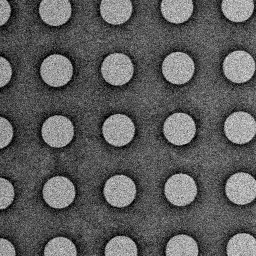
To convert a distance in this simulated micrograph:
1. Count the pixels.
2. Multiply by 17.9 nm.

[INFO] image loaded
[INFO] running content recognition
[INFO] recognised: an array of small figures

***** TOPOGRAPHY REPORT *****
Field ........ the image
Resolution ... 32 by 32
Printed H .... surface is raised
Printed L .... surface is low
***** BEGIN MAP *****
HLLLLHHHHLLLLHHHLLLLHHHHLLLLHHHH
HLLLLHHHHLLLLHHHLLLLHHHHLLLLHHHH
HLLLLHHHLLLLLHHHLLLLLHHLLLLLLHHL
LLLLLLLLLLLLLLLLLLLLLLLLLLLLLLLL
LLLLLLLLLLLLLLLLLLLLLLLLLLLLLLLL
LLLLLLLLLLLLLLLLLLLLLLLLLLLLLLLL
LLLLLLLLLLLLLLLLLLLLLLLLLLLLLHHL
HLLLLLHHHLLLLHHHLLLLLHHHLLLLHHHH
HLLLLHHHHLLLLHHHHLLLHHHHLLLLHHHH
HLLLLHHHHLLLLHHHLLLLLHHHLLLLHHHL
HLLLLLHHLLLLLLHLLLLLLLLLLLLLLLLL
LLLLLLLLLLLLLLLLLLLLLLLLLLLLLLLL
LLLLLLLLLLLLLLLLLLLLLLLLLLLLLLLL
LLLLLLLLLLLLLLLLLLLLLLLLLLLLLLLL
LLLLLLLHLLLLLLHHLLLLLHHHLLLLLHHL
HLLLLHHHHLLLLHHHHLLLLHHHLLLLHHHH
HHLLLHHHHLLLLHHHHLLLLHHHLLLLHHHH
HLLLLLHHHLLLLHHHLLLLLHHHLLLLLHHL
LLLLLLLLLLLLLLLLLLLLLLLLLLLLLLLL
LLLLLLLLLLLLLLLLLLLLLLLLLLLLLLLL
LLLLLLLLLLLLLLLLLLLLLLLLLLLLLLLL
LLLLLLLLLLLLLLLLLLLLLLLLLLLLLLLL
HLLLLLHHHLLLLLHHLLLLLHHHLLLLLHHH
HHLLLHHHHLLLLHHHHLLLLHHHHLLLHHHH
HHLLLHHHHLLLLHHHHLLLLHHHLLLLHHHH
HLLLLLHHHLLLLLHHLLLLLLHLLLLLLLHL
LLLLLLLLLLLLLLLLLLLLLLLLLLLLLLLL
LLLLLLLLLLLLLLLLLLLLLLLLLLLLLLLL
LLLLLLLLLLLLLLLLLLLLLLLLLLLLLLLL
LLLLLLLLLLLLLLLLLLLLLLHLLLLLLHHL
HLLLLLHHHLLLLHHHHLLLLHHHHLLLHHHH
HHLLLLHHHLLLLHHHHLLLLHHHHLLLHHHH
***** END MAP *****